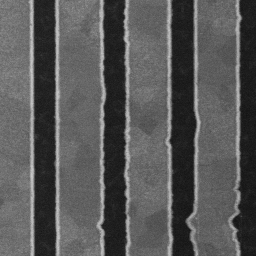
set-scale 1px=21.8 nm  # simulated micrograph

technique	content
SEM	one or a few lines or trenches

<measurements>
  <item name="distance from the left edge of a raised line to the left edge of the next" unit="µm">1.49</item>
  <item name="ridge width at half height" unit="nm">917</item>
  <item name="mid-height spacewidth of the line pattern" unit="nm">562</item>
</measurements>